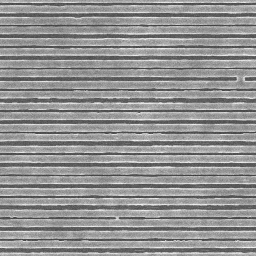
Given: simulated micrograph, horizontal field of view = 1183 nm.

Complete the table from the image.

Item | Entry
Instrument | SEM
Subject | parallel lines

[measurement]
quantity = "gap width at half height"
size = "16.2 nm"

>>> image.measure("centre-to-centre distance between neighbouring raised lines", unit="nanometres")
49.4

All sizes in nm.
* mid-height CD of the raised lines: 36.4